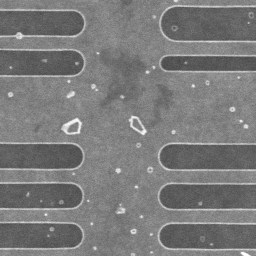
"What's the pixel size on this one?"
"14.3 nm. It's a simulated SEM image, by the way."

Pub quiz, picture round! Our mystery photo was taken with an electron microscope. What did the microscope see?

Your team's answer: groups of lines, slits or small figures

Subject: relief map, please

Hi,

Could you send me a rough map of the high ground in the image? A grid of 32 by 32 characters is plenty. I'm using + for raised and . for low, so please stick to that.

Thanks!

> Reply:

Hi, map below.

++++++++++++++++++++++++++++++++
..........+++++++++++...........
...........+++++++++............
..........++++++++++............
..+......++++++++++++...........
++++++++++++++++++++++++++++++++
..........++++++++++++++++++++++
..........++++++++++............
..........++++++++++............
.........+++++++++++++++++++++++
++++++++++++++++++++++++++++++++
++++++++++++++++++++++++++++++++
++++++++++++++++++++++++++++++++
++++++++++++++++++++++++++++++++
++++++++++++++++++++++++++++++++
++++++++++++++++++++++++++++++++
++++++++++++++++++++++++++++++++
++++++++++++++++++++++++++++++++
..........++++++++++............
..........++++++++++............
..........++++++++++............
++++++++++++++++++++++++++++++++
++++++++++++++++++++++++++++++++
..........++++++++++............
..........++++++++++............
..........++++++++++............
++++++++++++++++++++++++++++++++
++++++++++++++++++++++++++++++++
..........++++++++++............
..........++++++++++............
..........++++++++++............
++++++++++++++++++++++++++++++++